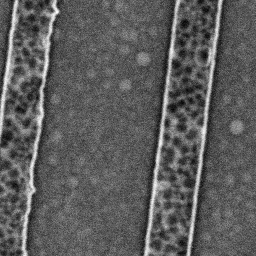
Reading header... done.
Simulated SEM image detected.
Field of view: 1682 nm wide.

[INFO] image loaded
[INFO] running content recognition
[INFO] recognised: one or a few lines or trenches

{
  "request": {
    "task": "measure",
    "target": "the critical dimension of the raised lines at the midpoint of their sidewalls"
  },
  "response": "0.277 µm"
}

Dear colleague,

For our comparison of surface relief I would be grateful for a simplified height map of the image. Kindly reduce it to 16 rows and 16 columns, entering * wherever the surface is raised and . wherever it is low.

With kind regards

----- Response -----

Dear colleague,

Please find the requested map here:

.**........***..
.**........***..
.**........**...
.**........**...
***........**...
***.......***...
***.......***...
**........***...
**........***...
**........***...
**........**....
**........**....
**........**....
**.......***....
**.......***....
**.......***....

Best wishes